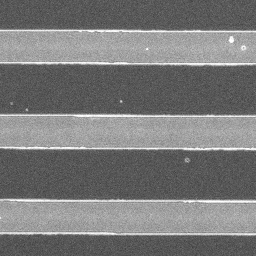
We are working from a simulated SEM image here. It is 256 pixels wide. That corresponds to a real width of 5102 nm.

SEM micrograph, lines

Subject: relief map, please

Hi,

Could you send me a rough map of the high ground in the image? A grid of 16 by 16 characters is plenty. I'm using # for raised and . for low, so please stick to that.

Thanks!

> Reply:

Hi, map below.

################
################
................
................
################
################
################
................
................
################
################
################
.###############
................
................
################